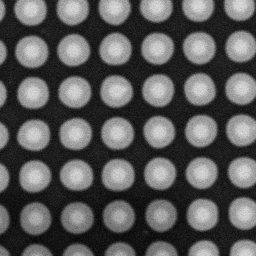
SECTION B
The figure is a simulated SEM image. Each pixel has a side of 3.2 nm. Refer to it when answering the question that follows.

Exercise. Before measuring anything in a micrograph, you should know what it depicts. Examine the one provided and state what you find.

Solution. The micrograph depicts an array of small figures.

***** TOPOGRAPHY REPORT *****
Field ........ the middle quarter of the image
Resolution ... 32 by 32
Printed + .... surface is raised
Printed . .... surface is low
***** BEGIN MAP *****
..+.............................
................................
................................
.+++.......++++......+++++.....+
++++++....++++++....+++++++....+
++++++...++++++++...+++++++...++
+++++++..++++++++...+++++++...++
+++++++..++++++++...+++++++...++
++++++...++++++++...+++++++....+
++++++....++++++.....+++++......
.++++......++++........++.......
................................
................................
.............+........+++.......
++++++.....+++++.....++++++....+
++++++....+++++++...+++++++....+
+++++++..++++++++...++++++++..++
+++++++..++++++++...++++++++..++
+++++++..++++++++...+++++++....+
++++++....+++++++....++++++....+
++++++.....+++++......+++.......
................................
................................
.......................++.......
.++++......+++++.....++++++.....
++++++....+++++++....+++++++...+
+++++++...+++++++...++++++++...+
+++++++...++++++++..++++++++...+
+++++++...++++++++..++++++++...+
+++++++...+++++++....++++++....+
++++++....+++++++.....+++++.....
..+++.......+++.................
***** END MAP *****